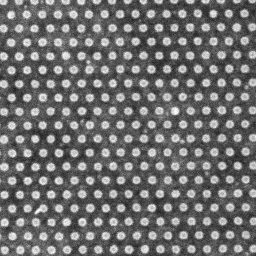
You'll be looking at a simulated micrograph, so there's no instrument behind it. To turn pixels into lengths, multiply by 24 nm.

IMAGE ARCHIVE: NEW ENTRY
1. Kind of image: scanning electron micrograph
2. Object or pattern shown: a regular array of raised bodies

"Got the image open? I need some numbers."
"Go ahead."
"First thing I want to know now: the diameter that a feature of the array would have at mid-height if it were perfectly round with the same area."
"0.167 um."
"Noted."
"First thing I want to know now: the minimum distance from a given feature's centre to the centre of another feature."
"15.3 pixels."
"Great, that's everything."